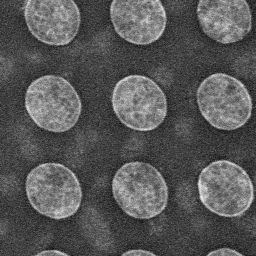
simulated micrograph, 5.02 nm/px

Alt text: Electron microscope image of raised bodies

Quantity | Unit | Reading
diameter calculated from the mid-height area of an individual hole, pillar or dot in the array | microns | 0.273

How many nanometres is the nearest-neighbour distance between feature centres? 428